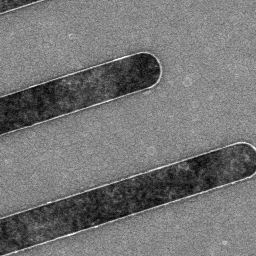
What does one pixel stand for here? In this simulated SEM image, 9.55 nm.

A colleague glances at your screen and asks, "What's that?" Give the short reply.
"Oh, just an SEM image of one or a few lines or trenches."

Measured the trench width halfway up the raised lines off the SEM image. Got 757 nm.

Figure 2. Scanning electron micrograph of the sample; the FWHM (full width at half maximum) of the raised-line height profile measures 350 nanometres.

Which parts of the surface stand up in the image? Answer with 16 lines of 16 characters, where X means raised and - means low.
X---------------
----------------
----------------
--------XX------
-----XXXXX------
--XXXXXXX-------
XXXXXX----------
XXX-------------
----------------
-------------XXX
----------XXXXXX
-------XXXXXXX--
----XXXXXXX-----
-XXXXXXX--------
XXXXX-----------
XX--------------